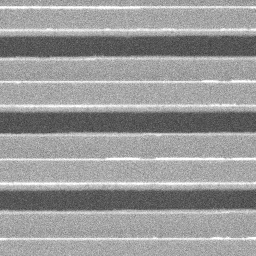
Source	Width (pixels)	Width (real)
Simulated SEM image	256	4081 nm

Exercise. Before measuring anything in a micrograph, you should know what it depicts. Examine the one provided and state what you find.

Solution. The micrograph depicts lines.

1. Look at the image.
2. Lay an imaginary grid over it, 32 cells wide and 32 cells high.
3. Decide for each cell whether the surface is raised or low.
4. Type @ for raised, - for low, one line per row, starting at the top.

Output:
@@@@@@@@@@@@@@@@@@@@@@@@@@@@@@@@
@@@@@@@@@@@@@@@@@@@@@@@@@@@@@@@@
@@@@@@@@@@@@@@@@@@@@@@@@@@@@@@@@
@@@@@@@@@@@@@@@@@@@@@@@@@@@@@@@@
--------------------------------
--------------------------------
--------------------------------
@@@@@@@@@@@@@@@@@@@@@@@@@@@@@@@@
@@@@@@@@@@@@@@@@@@@@@@@@@@@@@@@@
@@@@@@@@@@@@@@@@@@@@@@@@@@@@@@@@
@@@@@@@@@@@@@@@@@@@@@@@@@@@@@@@@
@@@@@@@@@@@@@@@@@@@@@@@@@@@@@@@@
@@@@@@@@@@@@@@@@@@@@@@@@@@@@@@@@
--------------------------------
--------------------------------
--------------------------------
--------------------------------
@@@@@@@@@@@@@@@@@@@@@@@@@@@@@@@@
@@@@@@@@@@@@@@@@@@@@@@@@@@@@@@@@
@@@@@@@@@@@@@@@@@@@@@@@@@@@@@@@@
@@@@@@@@@@@@@@@@@@@@@@@@@@@@@@@@
@@@@@@@@@@@@@@@@@@@@@@@@@@@@@@@@
@@@@@@@@@@@@@@@@@@@@@@@@@@@@@@@@
--------------------------------
--------------------------------
--------------------------------
---------------------------@@@@@
@@@@@@@@@@@@@@@@@@@@@@@@@@@@@@@@
@@@@@@@@@@@@@@@@@@@@@@@@@@@@@@@@
@@@@@@@@@@@@@@@@@@@@@@@@@@@@@@@@
@@@@@@@@@@@@@@@@@@@@@@@@@@@@@@@@
@@@@@@@@@@@@@@@@@@@@@@@@@@@@@@@@